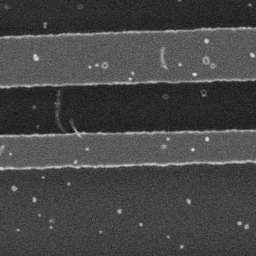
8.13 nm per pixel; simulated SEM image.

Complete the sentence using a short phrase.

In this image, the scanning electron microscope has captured lines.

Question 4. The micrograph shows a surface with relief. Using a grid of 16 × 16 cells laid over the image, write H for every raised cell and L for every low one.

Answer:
LLLLLLLLLLLLLLLL
LLLLLLLLLLLLLLLL
HHHHHHHHHHHHHHHH
HHHHHHHHHHHHHHHH
HHHHHHHHHHHHHHHH
LLLLLLLLLLLLLLLL
LLLLLLLLLLLLLLLL
LLLLLLLLLLLLLLLL
HHHHHHHHHHHHHHHH
HHHHHHHHHHHHHHHH
HHHLLLLLLLLLLLLL
LLLLLLLLLLLLLLLL
LLLLLLLLLLLLLLLL
LLLLLLLLLLLLLLLL
LLLLLLLLLLLLLLLL
LLLLLLLLLLLLLLLL